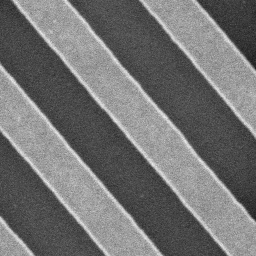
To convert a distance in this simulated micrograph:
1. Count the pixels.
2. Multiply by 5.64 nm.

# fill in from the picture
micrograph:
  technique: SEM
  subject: lines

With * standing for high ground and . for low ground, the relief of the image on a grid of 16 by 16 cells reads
.****....****...
..***.....****..
...***.....***..
....***.....***.
.....***.....***
*....****....***
**....****....**
***....****....*
****....***.....
.****....***....
..****....***...
...***.....***..
....***....****.
.....***....****
*....****....***
**....****....**